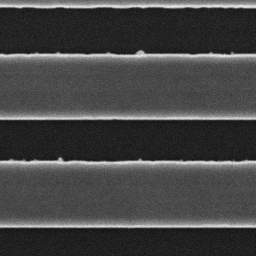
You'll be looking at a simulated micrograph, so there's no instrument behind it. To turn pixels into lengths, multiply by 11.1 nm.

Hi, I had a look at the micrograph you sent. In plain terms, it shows lines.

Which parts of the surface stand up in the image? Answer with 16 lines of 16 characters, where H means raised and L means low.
LLLLLLLLLLLLLLLL
LLLLLLLLLLLLLLLL
LLLLLLLLLLLLLLLL
HHHHHHHHHHHHHHHH
HHHHHHHHHHHHHHHH
HHHHHHHHHHHHHHHH
HHHHHHHHHHHHHHHH
LLLLLLLLLLLLLLLL
LLLLLLLLLLLLLLLL
LLLLLLLLLLLLLLLL
HHHHHHHHHHHHHHHH
HHHHHHHHHHHHHHHH
HHHHHHHHHHHHHHHH
HHHHHHHHHHHHHHHH
LLLLLLLLLLLLLLLL
LLLLLLLLLLLLLLLL